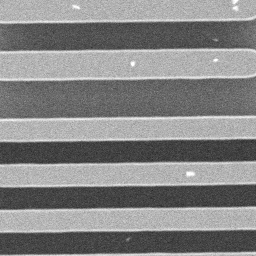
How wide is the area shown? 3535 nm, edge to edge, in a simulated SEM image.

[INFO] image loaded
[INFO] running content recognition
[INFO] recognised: groups of lines, slits or small figures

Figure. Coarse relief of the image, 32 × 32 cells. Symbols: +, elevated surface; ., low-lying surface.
++++++++++++++++++++++++++++++++
++++++++++++++++++++++++++++++++
+++++++++++++++++++++++++++.....
................................
................................
................................
...+++++++++++++++++++++++++++++
++++++++++++++++++++++++++++++++
++++++++++++++++++++++++++++++++
++++++++++++++++++++++++++++++++
................................
................................
................................
................................
................................
++++++++++++++++++++++++++++++++
++++++++++++++++++++++++++++++++
++++++++++++++++................
................................
................................
................++++++++++++++++
++++++++++++++++++++++++++++++++
++++++++++++++++++++++++++++++++
................................
................................
................................
++++++++++++++++++++++++++++++++
++++++++++++++++++++++++++++++++
++++++++++++++++++++++++++++++++
................................
................................
................................